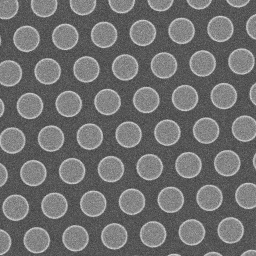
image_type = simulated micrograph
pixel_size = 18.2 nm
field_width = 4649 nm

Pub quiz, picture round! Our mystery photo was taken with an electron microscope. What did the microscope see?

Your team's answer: an array of small figures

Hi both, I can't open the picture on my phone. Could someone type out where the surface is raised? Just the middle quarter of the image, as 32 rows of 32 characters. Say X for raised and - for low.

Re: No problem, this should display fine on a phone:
--XXXXXXX---XXXXXX----XXXXXX----
---XXXXXX---XXXXXX----XXXXXX----
---XXXXXX----XXXXX-----XXXX-----
---XXXXX-----XXXX---------------
--------------------------------
-----------------------------XX-
----------XX------XXXX------XXXX
XXX-----XXXXX-----XXXXX----XXXXX
XXXX----XXXXXX---XXXXXXX---XXXXX
XXXX----XXXXXX---XXXXXXX---XXXXX
XXXX----XXXXXX----XXXXX-----XXXX
XXXX----XXXXX-----XXXXX------XX-
XXX-------XX--------------------
--------------------------------
------------------------XXX-----
-----XXX------XXXX-----XXXXXX---
----XXXXX----XXXXXX----XXXXXX---
---XXXXXX----XXXXXX----XXXXXX---
---XXXXXXX---XXXXXX----XXXXXX---
----XXXXX----XXXXXX-----XXXX----
----XXXXX------XX---------------
--------------------------------
------------------------------XX
----------XXX------XXXX------XXX
XXXX-----XXXXX-----XXXXX----XXXX
XXXXX----XXXXXX---XXXXXXX---XXXX
XXXXX----XXXXXX---XXXXXXX---XXXX
XXXXX----XXXXXX----XXXXX-----XXX
XXXXX-----XXXX------XXX---------
XXX-----------------------------
--------------------------------
----------------XX-------XXXX---